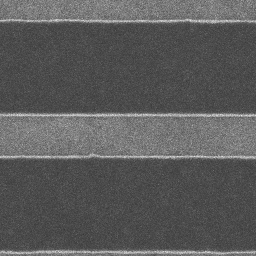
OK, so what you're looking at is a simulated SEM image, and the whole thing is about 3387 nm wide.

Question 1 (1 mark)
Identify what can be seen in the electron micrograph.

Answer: one or a few lines or trenches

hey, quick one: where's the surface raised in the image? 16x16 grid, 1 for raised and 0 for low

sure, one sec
0000000000000000
1111111111111111
1111111111111111
1111111111111111
1111111111111111
1111111111111111
1111111111111111
0000000000000000
0000000000000000
0000000000000000
1111111111111111
1111111111111111
1111111111111111
1111111111111111
1111111111111111
1111111111111111